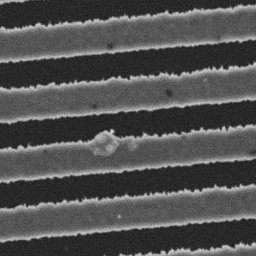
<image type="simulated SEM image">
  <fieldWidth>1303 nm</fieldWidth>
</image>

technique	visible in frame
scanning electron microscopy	lines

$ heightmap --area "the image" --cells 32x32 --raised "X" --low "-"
--------------------------------
-----------------------XXXXXXXXX
-----------XXXXXXXXXXXXXXXXXXXXX
--XXXXXXXXXXXXXXXXXXXXXXXXXXXXXX
XXXXXXXXXXXXXXXXXXXXXXXXXXXXXXXX
XXXXXXXXXXXXXXXXXXXXXXXXXXX-----
XXXXXXXXXXXXXXX-----------------
XXXXX---------------------------
--------------------------X-XXXX
-------------------XXXXXXXXXXXXX
------X-XXXXXXXXXXXXXXXXXXXXXXXX
XXXXXXXXXXXXXXXXXXXXXXXXXXXXXXXX
XXXXXXXXXXXXXXXXXXXXXXXXXXXXXXXX
XXXXXXXXXXXXXXXXXXXXX-----------
XXXXXXXXXX----------------------
--------------------------------
-------------X----------XXXXXXXX
-----------XXXXXXXXXXXXXXXXXXXXX
--XXXXXXXXXXXXXXXXXXXXXXXXXXXXXX
XXXXXXXXXXXXXXXXXXXXXXXXXXXXXXXX
XXXXXXXXXXXXXXXXXXXXXXXX--------
XXXXXXXXXXXXXXX-----------------
XXXX----------------------------
--------------------------XXXXXX
------------------XXXXXXXXXXXXXX
-----XXXXXXXXXXXXXXXXXXXXXXXXXXX
XXXXXXXXXXXXXXXXXXXXXXXXXXXXXXXX
XXXXXXXXXXXXXXXXXXXXXXXXXXXXX---
XXXXXXXXXXXXXXXXXXX-------------
XXXXXXXX------------------------
--------------------------------
--------------------XXXXXXXXXXXX